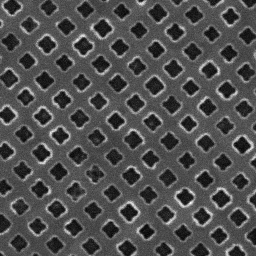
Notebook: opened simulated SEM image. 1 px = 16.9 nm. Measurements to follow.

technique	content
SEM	a regular array of holes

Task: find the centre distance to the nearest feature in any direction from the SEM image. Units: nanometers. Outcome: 430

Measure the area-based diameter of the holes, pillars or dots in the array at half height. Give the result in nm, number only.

268